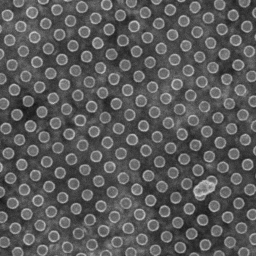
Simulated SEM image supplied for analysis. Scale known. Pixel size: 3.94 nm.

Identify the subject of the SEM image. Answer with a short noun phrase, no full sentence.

a regular array of raised bodies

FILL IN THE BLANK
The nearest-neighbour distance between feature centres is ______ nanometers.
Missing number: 68.5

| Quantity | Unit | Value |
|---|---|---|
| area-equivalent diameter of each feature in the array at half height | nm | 42.4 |